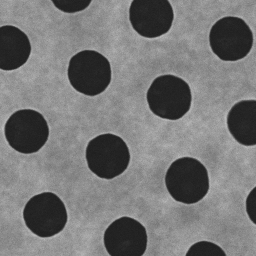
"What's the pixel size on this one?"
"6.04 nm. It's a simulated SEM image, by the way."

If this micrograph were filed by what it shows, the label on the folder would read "holes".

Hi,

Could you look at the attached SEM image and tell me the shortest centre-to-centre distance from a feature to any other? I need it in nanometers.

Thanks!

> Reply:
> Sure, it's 506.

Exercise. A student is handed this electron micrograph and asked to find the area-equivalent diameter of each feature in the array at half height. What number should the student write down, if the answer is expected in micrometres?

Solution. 0.268